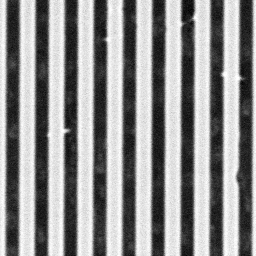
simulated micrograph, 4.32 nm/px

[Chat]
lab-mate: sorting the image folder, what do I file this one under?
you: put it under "parallel lines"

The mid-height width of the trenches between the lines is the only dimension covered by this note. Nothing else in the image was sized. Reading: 61 nanometers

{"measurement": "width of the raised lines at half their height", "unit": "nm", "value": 64.7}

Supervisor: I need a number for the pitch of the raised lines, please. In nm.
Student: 126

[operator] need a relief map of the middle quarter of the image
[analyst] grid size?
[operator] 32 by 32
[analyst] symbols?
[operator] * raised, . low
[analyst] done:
....***....***....****....***...
....***....***....****....***...
....***....***....****....***...
....***....***....****....***...
....***....***....****....***...
....***....***....****....***...
....***....***....****....***...
....***....***....****....***...
....***....***....****....***...
....***....***....****....***...
....***....***....****....***...
....***....***....****....***...
....***....***....****...****...
....***....***....****...****...
....***....***....****...****...
....***....***....****...****...
....***....***....****...****...
....***....***....****...****...
....***....***....****...****...
....***....***....****...****...
....***....***....****...****...
....***....***....****...****...
....***....***....****...****...
....***....***....****...****...
....***....***....****...****...
....***....***....****...****...
....***....***....****...****...
....***....***....****...****...
....***....***....****...****...
....***....***....****...****...
....***....***....****...****...
....***....***....****...****...